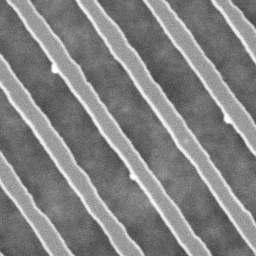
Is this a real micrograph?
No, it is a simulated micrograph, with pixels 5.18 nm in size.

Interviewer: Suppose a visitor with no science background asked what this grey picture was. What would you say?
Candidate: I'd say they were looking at lines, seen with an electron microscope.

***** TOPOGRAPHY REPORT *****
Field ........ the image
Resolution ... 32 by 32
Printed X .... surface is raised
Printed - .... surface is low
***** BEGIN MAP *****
-XXX------XX------XXX------XX---
--XXX------XX------XXX------XX--
---XXX-----XXX------XX------XXX-
---XXX------XXX-----XXX------XXX
----XXX------XX------XXX------XX
-----XXX-----XXX------XXX-----XX
------XX------XXX------XX------X
X-----XXX------XXX-----XXX------
X------XXX------XX------XXX-----
XX------XX------XXX------XXX----
XXX-----XXX------XXX-----XXX----
-XX------XXX------XX------XXX---
-XXX------XX------XXX------XXX--
--XXX------XX------XXX------XX--
---XXX-----XXX------XXX-----XXX-
----XX------XXX-----XXX------XXX
----XXX------XX------XXX------XX
-----XXX-----XXX------XXX------X
------XX------XXX-----XXX------X
------XXX------XX------XXX------
X------XXX------XX------XXX-----
XX------XXX-----XXX------XX-----
XX------XXX------XXX-----XXX----
XXX------XXX------XX------XXX---
-XXX------XX------XXX------XX---
--XX------XXX------XXX-----XXX--
---XX------XXX------XXX-----XXX-
---XXX------XXX-----XXX------XXX
----XXX------XXX-----XXX------XX
-----XXX-----XXX------XXX-----XX
-----XXX------XXX-----XXX------X
------XXX------XXX-----XXX------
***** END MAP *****